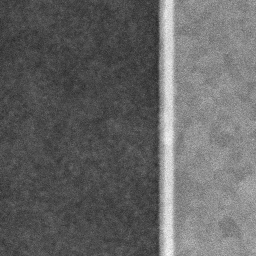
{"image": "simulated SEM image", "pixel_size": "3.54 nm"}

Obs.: one or a few lines or trenches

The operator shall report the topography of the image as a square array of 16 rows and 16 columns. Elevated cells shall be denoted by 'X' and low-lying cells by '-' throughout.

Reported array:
-----------XXXXX
-----------XXXXX
-----------XXXXX
-----------XXXXX
-----------XXXXX
-----------XXXXX
-----------XXXXX
-----------XXXXX
-----------XXXXX
-----------XXXXX
-----------XXXXX
-----------XXXXX
-----------XXXXX
-----------XXXXX
-----------XXXXX
-----------XXXXX